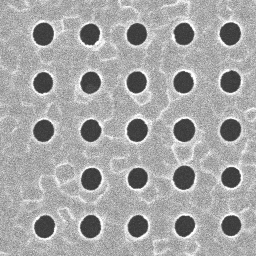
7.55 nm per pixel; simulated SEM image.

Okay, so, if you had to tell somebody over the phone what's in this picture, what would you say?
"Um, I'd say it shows a regular array of holes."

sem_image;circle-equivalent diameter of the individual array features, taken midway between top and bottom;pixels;21.6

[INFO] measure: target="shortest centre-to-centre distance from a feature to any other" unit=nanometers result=353